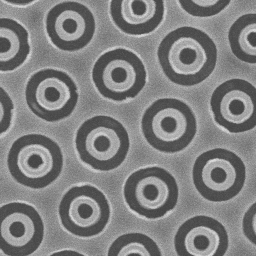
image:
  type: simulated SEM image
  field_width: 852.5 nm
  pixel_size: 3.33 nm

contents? a regular array of ring-shaped grooves with a dot in the middle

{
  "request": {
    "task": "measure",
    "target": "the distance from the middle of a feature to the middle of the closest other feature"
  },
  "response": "0.227 um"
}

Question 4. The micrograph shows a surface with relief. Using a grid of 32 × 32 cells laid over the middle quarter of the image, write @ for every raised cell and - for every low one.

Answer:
@@@@@@@@---@@@@@@---@@@@---@@@@@
@@@@@@@---@@---@@---@@@@@--@@@@@
@@@@@@@---@@----@@--@@@@@----@@@
-@@@@@@---@@----@@--@@@@@@------
--@@@@@@--@@@-@@@@--@@@@@@@-----
@--@@@@@--@@@@@@@---@@@@@@@@@@--
@--@@@@@@---@@@@---@@@@@@@@@@@@@
@@-@@@@@@---------@@@@@@@@@@@@@@
@--@@@@@@@@-----@@@@@@@@@@@@@@@@
@--@@@@@@@@@@@@@@@@@@@--------@@
---@@@@@@@@@@@@@@@@@@----------@
--@@@@@@@@@@@@@@@@@@-----@@@----
--@@@@@@@@@@@@@@@@@@---@@@@@@---
@@@@@@@-----@@@@@@@@--@@@--@@@--
@@@@@---------@@@@@---@@----@@--
@@@@-----------@@@@---@@----@@@-
@@@----@@@@@---@@@@---@@@---@@--
@@@---@@@@@@@---@@@@---@@@@@@@--
@@@---@@---@@@--@@@@----@@@@@---
@@@--@@@---@@@--@@@@@-----------
@@@---@@---@@@--@@@@@@---------@
@@@---@@---@@---@@@@@@@------@@@
@@@@---@@@@@@---@@@@@@@@@@@@@@@@
@@@@----@@@@---@@@@@@@@@@@@@@@@@
@@@@@----------@@@@@@@@@@@@@@@@@
@@@@@@@-------@@@@@@@@@@@@@@@@@@
@@@@@@@@@--@@@@@@@@------@@@@@@@
@@@@@@@@@@@@@@@@@----------@@@@@
@@@@@@@@@@@@@@@@-----@@-----@@@@
@@@@@@@@@@@@@@@@---@@@@@@---@@@@
@@@@@--@@@@@@@@---@@---@@@--@@@@
@-------@@@@@@@---@@---@@@---@@@